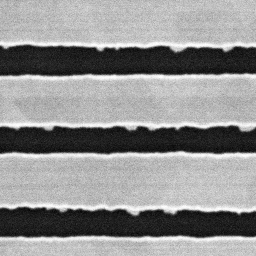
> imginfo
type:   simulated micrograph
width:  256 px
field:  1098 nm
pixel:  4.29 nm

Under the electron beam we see lines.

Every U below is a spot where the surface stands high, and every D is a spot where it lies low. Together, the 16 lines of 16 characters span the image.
UUUUUUUUUUUUUUUU
UUUUUUUUUUUUUUUU
UUUUUUUUUUUUUUUU
DDDDDDDDDDDDDDDD
DDDDDDDDDDDDDDDD
UUUUUUUUUUUUUUUU
UUUUUUUUUUUUUUUU
UUUUUUUUUUUUUUUU
DDDDDDDDDDDDDDDD
DDDDDDDDDDDDDDDD
UUUUUUUUUUUUUUUU
UUUUUUUUUUUUUUUU
UUUUUUUUUUUUUUUU
DDDDDDDDDDDDDDDD
DDDDDDDDDDDDDDDD
UUUUUUUUUUUUUUUU